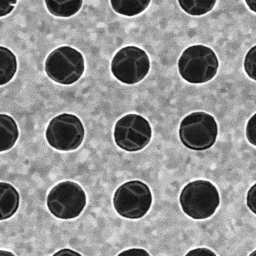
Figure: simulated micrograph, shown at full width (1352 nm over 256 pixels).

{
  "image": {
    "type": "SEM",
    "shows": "a regular array of holes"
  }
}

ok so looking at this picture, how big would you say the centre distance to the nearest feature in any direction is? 345 nm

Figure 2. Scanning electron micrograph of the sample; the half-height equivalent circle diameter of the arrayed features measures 205 nm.